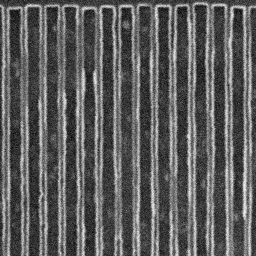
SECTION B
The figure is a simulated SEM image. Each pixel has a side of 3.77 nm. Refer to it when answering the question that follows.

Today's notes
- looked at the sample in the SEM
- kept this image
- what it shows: parallel lines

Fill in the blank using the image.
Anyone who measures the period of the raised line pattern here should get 70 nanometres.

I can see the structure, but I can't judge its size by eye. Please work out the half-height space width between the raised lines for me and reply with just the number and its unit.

0.0429 micrometres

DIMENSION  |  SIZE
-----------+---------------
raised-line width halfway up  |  26.9 nm